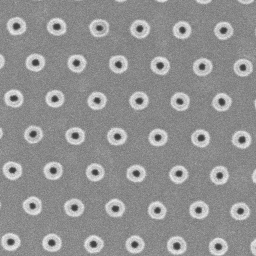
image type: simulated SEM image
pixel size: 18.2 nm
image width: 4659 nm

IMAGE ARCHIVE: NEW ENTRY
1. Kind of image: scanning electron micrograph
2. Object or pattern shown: a regular array of ring-shaped raised bodies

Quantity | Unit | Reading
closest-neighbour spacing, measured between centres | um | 0.74